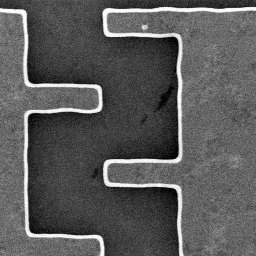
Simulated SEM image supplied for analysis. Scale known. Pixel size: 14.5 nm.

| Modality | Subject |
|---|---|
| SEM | groups of lines, slits or small figures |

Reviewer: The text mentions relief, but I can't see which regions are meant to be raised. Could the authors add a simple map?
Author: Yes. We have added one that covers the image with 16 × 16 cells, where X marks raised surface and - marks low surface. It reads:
----------------
XX-----XXXXXXXXX
XX---------XXXXX
XX---------XXXXX
XX---------XXXXX
XXXXXX-----XXXXX
XXXXXX-----XXXXX
XX---------XXXXX
XX---------XXXXX
XX---------XXXXX
XX-----XXXXXXXXX
XX-----XXXXXXXXX
XX---------XXXXX
XX---------XXXXX
XX---------XXXXX
XXXXXX-----XXXXX